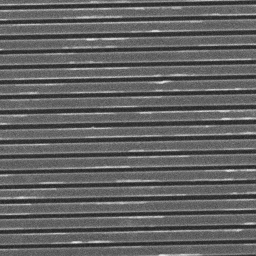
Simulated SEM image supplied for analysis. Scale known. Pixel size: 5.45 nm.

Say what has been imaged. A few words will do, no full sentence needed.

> parallel lines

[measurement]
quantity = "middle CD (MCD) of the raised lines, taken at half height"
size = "57.2 nanometers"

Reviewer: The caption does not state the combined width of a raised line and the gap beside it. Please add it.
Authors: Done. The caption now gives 0.0815 microns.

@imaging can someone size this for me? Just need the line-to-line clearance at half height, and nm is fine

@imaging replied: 24.5